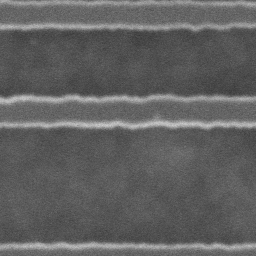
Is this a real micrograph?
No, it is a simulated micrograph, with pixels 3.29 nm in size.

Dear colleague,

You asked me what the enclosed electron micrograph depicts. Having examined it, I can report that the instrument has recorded lines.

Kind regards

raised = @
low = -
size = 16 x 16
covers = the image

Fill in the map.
@@@@@@@@@@@@@@@@
@@@@@@@@@@@@@@@@
----------------
----------------
----------------
----------------
@@@@@@@@@@@@@@@@
@@@@@@@@@@@@@@@@
----------------
----------------
----------------
----------------
----------------
----------------
----------------
@@@@@@@@@@@@@@@@